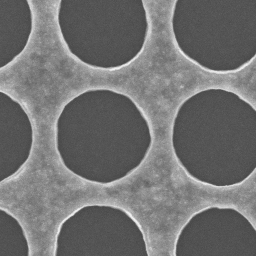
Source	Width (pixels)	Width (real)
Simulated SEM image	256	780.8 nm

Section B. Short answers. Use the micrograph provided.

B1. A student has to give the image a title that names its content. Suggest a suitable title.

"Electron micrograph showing holes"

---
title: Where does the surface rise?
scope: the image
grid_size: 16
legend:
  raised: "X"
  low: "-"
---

--XX-----XX-----
--XX-----XX-----
--XX-----XX-----
-XXXX---XXXX----
XXXXXXXXXXXXXXXX
XXXXXXXXXXXXXXXX
-XXX----XXX----X
--XX-----XX-----
--XX-----XX-----
--XX-----XX-----
-XXX----XXXX----
XXXXXXXXXXXXX--X
XXXXXXXXXXXXXXXX
-XXX----XXXX---X
-XXX-----XX-----
--XX-----XX-----